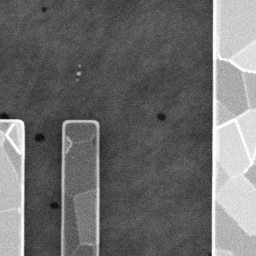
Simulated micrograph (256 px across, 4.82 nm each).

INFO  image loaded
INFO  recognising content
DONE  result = wiring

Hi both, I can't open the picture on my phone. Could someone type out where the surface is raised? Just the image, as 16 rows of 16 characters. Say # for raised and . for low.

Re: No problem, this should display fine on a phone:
.............###
.............###
.............###
.............###
.............###
.............###
.............###
.............###
#...##.......###
#...##.......###
#...##.......###
#...##.......###
#...##.......###
#...##.......###
#...##.......###
#...##.......###